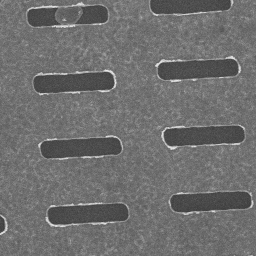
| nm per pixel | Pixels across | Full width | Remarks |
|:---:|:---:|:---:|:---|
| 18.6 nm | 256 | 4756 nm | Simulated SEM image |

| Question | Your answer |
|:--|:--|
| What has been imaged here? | holes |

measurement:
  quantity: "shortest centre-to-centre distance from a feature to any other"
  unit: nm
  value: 1230